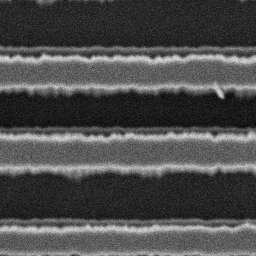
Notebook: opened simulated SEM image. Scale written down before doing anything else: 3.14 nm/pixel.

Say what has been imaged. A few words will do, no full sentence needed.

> lines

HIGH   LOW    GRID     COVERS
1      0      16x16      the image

0000000000000000
0000000000000000
0000000000000000
0000100010001100
1111111111111111
1111111111101111
0000000000000000
0000000000000000
1111111111111111
1111111111111111
1111111111001110
0000000000000000
0000000000000000
0000000000000000
1111111111111111
1111111111111111